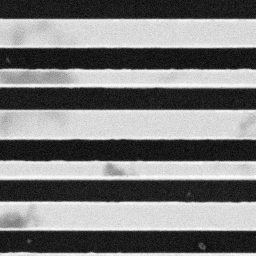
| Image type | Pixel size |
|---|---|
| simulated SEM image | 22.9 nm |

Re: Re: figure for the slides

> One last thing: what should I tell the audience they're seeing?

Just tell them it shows lines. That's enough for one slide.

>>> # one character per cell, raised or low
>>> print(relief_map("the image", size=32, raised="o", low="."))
................................
................................
oooooooooooooooooooooooooooooooo
oooooooooooooooooooooooooooooooo
oooooooooooooooooooooooooooooooo
oooooooooooooooooooooooooooooooo
................................
................................
................................
oooooooooooooooooooooooooooooooo
oooooooooooooooooooooooooooooooo
................................
................................
................................
oooooooooooooooooooooooooooooooo
oooooooooooooooooooooooooooooooo
oooooooooooooooooooooooooooooooo
................................
................................
................................
oooooooooooooooooooooooooooooooo
oooooooooooooooooooooooooooooooo
................................
................................
................................
oooooooooooooooooooooooooooooooo
oooooooooooooooooooooooooooooooo
oooooooooooooooooooooooooooooooo
oooooooooooooooooooooooooooooooo
................................
................................
................................